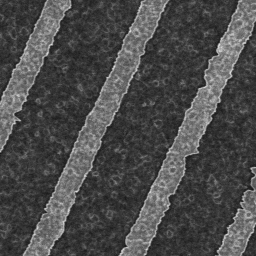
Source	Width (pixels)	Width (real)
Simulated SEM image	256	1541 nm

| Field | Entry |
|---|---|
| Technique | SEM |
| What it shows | one or a few lines or trenches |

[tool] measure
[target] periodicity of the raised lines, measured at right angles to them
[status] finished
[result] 520 nm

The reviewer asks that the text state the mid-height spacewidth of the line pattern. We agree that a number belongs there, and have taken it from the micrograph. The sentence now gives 388 nm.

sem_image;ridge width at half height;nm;132